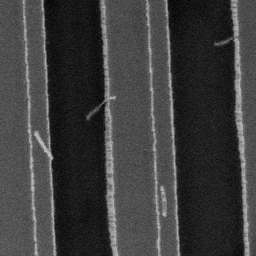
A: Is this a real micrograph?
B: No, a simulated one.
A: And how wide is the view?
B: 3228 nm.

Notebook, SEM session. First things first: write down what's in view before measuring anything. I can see lines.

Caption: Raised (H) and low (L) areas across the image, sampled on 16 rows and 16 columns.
HHHLLLHHHHLLLLLH
HHHLLLLHHHLLLLLH
HHHLLLLHHHHLLLLH
HHHLLLLHHHHLLLLH
HHHLLLLHHHHLLLLH
HHHLLLLHHHHLLLLH
HHHLLLLHHHHLLLLH
HHHLLLLHHHHLLLLH
HHHLLLLHHHHLLLLH
HHHLLLLHHHHLLLLH
HHHLLLLHHHHLLLLH
HHHLLLLHHHHLLLLH
HHHLLLLHHHHLLLLH
HHHLLLLHHHHLLLLH
HHHLLLLHHHHLLLLH
HHHLLLLHHHHLLLLH